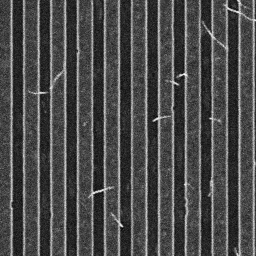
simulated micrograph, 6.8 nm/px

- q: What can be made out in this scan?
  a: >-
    parallel lines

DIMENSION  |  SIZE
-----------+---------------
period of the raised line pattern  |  0.183 um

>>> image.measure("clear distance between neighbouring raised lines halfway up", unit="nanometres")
81.7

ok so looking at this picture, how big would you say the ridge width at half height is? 101 nanometres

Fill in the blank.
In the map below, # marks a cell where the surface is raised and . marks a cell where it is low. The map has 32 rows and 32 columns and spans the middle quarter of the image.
...####...####...####...###...##
...####...####...####...###...##
...####...####...####...###...##
...####...####...###....###...##
...####...####...####...###...##
...####...####...####...###...##
...####...####...####...###...##
...####...####...####...###...##
...####...####...####...###...##
...####...####...###....###...##
...####...####...####...###...##
...####...####...####...###...##
...####...####...####...###....#
...####...####...###...####....#
...####...####...####...###...##
...####...####...####...###...##
...####...####...####...###...##
...####...####...####...###...##
...####...####...####...###....#
...####...####...####...###....#
...####...####...####...###...##
...####...####...####...###...##
...####...####...####...###...##
...####...####...####...###...##
...####...####...####...###...##
...####...####...####...###...##
...####...####...####...###...##
...####...####...####...###...##
...####...####...####...###...##
...####...####...####...###...##
...####...####...####...###...##
...####...####...####...###....#